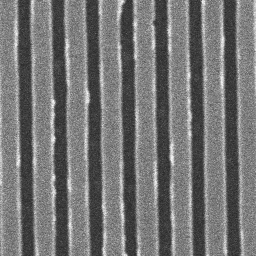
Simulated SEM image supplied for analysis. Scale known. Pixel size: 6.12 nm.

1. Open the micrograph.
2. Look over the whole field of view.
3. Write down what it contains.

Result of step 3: parallel lines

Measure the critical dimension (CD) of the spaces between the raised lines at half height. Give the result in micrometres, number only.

0.0849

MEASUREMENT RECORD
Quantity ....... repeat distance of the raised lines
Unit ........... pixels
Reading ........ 34.2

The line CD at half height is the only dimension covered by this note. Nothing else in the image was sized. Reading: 19.9 pixels